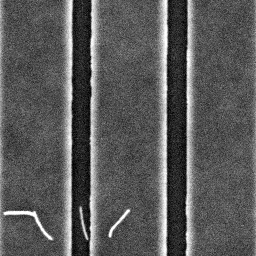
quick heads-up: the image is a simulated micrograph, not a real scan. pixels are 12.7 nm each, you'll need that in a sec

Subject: lines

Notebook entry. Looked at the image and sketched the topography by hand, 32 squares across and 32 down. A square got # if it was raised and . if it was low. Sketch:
#########...#########...########
#########..##########...########
#########...#########...########
#########...#########...########
#########..##########...########
#########..##########...########
#########..##########..#########
#########..##########..#########
#########..##########..#########
#########..##########..#########
#########..##########..#########
#########...#########..#########
#########..##########..#########
#########..##########..#########
#########..##########..#########
#########..##########..#########
#########..##########..#########
#########..##########..#########
#########..##########..#########
#########..##########..#########
#########..##########..#########
#########..##########..#########
#########..##########..#########
#########..##########..#########
#########..##########..#########
#########..##########..#########
#########..##########..#########
#########..##########..#########
#########..##########..#########
#########..##########..#########
#########..##########..#########
#########..##########..#########